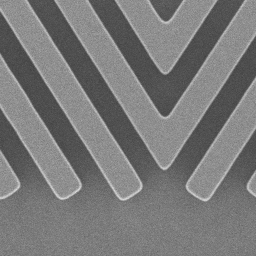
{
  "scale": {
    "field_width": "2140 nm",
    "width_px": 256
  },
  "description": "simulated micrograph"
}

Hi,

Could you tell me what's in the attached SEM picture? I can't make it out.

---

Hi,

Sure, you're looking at groups of lines, slits or small figures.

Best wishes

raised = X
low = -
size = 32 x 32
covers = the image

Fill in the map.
XXXX---XXXX----XXXX----XXXX---XX
XXXX----XXXX---XXXX---XXXX----XX
-XXXX---XXXXX---XXXX-XXXXX---XXX
-XXXXX---XXXX----XXXXXXXX---XXXX
--XXXX----XXXX---XXXXXXX----XXXX
---XXXX---XXXX----XXXXXX---XXXX-
---XXXX----XXXX---XXXXX---XXXXX-
----XXXX----XXXX---XXX----XXXX--
X----XXXX---XXXX----XX---XXXX---
XX---XXXX----XXXX-------XXXXX---
XX----XXXX---XXXXX------XXXX---X
XXX---XXXXX---XXXX-----XXXX----X
XXXX---XXXX----XXXX---XXXXX---XX
XXXX----XXXX---XXXX---XXXX---XXX
-XXXX---XXXX----XXXX-XXXX----XXX
-XXXXX---XXXX----XXXXXXXX---XXXX
--XXXX----XXXX---XXXXXXX---XXXXX
---XXXX---XXXX----XXXXX----XXXX-
---XXXX----XXXX---XXXXX---XXXX--
----XXXX---XXXXX---XXX----XXXX--
X---XXXXX---XXXX----X----XXXX---
XX---XXXX----XXXX-------XXXX----
XX----XXXX---XXXX-------XXXX---X
XX----XXXX----XXXX-----XXXX----X
X------XX------XX-------XX------
--------------------------------
--------------------------------
--------------------------------
--------------------------------
--------------------------------
--------------------------------
--------------------------------